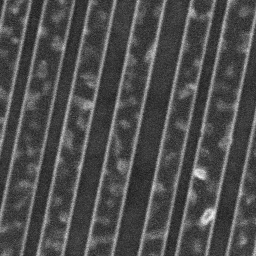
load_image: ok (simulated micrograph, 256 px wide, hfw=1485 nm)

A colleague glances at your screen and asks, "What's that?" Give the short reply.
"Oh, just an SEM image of parallel lines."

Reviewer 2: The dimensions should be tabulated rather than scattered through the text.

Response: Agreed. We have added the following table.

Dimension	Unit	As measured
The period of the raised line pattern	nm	263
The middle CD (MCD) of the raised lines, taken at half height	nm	158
